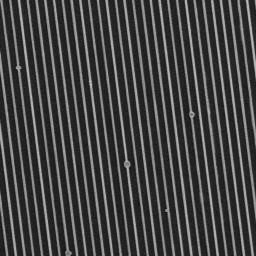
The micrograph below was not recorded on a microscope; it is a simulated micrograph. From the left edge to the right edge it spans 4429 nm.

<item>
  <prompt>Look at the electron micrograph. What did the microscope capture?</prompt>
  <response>parallel lines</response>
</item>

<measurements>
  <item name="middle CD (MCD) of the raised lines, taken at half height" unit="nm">30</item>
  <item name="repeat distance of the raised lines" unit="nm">151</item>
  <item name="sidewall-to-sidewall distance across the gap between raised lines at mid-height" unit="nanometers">118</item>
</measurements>